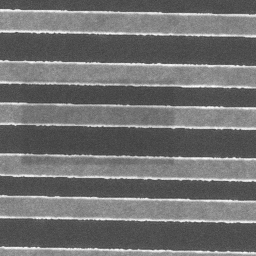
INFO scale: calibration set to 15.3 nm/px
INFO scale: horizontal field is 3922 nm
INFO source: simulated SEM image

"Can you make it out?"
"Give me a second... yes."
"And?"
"lines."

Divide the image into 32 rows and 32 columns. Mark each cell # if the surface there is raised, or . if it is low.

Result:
................................
###############.................
################################
################################
..............................##
................................
................................
................................
################################
################################
.........#######################
................................
................................
############################....
################################
################################
................................
................................
................................
############....................
################################
################################
......................#.########
................................
#...............................
################################
################################
................################
................................
................................
................................
###########################.#...